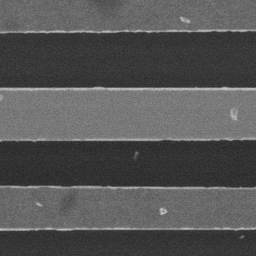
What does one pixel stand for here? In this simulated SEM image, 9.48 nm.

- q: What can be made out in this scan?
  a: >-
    lines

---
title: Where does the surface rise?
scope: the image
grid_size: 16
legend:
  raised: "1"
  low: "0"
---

1111111111111111
1111111111111111
0000000000000000
0000000000000000
0000000000000000
0000001000000110
1111111111111111
1111111111111111
1111111111111111
0000000000000000
0000000000000000
0000000000000000
1111111111111111
1111111111111111
0000000000000000
0000000000000000